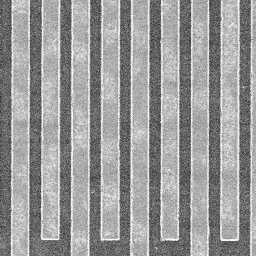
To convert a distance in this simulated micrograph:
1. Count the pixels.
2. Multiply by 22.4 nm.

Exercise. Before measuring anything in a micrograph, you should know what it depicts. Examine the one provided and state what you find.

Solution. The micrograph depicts parallel lines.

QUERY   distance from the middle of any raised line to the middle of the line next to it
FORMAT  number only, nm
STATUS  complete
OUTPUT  671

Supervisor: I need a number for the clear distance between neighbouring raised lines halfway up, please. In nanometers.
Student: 283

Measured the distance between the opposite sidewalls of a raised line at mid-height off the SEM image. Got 384 nm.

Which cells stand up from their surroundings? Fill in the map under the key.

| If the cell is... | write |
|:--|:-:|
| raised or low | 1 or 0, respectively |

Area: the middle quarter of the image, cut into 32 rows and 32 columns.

00111100001111000111100011110000
00111100001111000111100011110000
00111100001111000111100011110000
00111100001111000111100011110000
00111100001111000111100011111000
00111100011111000111100011110000
00111100001111000111100011110000
00111100011111000111100011110000
00111100001111000111100011110000
00111100001111000111100011110000
00111100001111000111100011110000
00111100001111000111100011110000
00111100001111000111100011110000
00111100001111000111100011110000
00111100001111000111100011110000
00111100001111000111100011110000
00111100001111000111100011110000
00111100001111000111100001111000
00111100001111000111100001110000
00111100011111000111100011110000
00111100011111000111100011110000
00111100001111000111100001110000
00111100001111000111100011110000
00111100001111000111100011110000
00111100001111000111100011110000
00111100011111000111100011110000
00111100011111000111100011111000
00111100011111000111100011110000
00111100011111000111100011110000
00111100011111000111100011110000
00111100011111000111100011110000
00111100011111000111100011110000